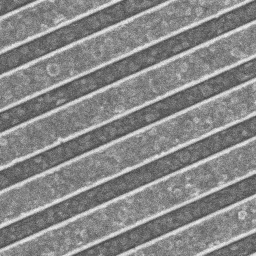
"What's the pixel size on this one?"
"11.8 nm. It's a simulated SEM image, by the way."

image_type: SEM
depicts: parallel lines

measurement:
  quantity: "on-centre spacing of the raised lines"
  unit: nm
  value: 625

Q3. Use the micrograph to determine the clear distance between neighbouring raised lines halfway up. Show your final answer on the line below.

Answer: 242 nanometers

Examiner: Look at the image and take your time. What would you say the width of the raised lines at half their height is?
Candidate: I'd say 379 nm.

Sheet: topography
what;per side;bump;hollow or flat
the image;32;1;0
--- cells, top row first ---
00001111111111000000111111111100
00111111111100000011111111110000
11111111100000001111111111000000
11111110000000111111111000000011
11111000000111111111100000001111
11100000011111111110000000111111
00000001111111111000000111111111
00000111111111000000011111111110
00111111111100000001111111111000
11111111110000000111111111100000
11111111000000111111111100000001
11111000000011111111110000001111
11100000001111111111000000111111
10000000111111111000000011111111
00000111111111100000001111111111
00011111111110000001111111111000
01111111111000000111111111100000
11111111000000011111111110000001
11111100000001111111110000000111
11110000001111111111000000011111
11000000111111111100000011111111
00000011111111110000001111111111
00001111111110000000111111111100
01111111111000000011111111100000
11111111100000011111111110000000
11111110000001111111111000000011
11110000000111111111100000011111
11000000011111111100000001111111
00000011111111110000000111111111
00001111111111000000011111111110
00111111111100000011111111110000
11111111100000001111111111000000